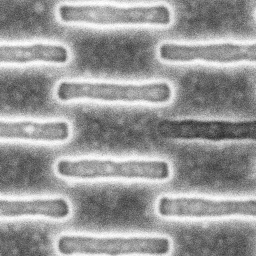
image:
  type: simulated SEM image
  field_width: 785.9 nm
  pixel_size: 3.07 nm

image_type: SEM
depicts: holes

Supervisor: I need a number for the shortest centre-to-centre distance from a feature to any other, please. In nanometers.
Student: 237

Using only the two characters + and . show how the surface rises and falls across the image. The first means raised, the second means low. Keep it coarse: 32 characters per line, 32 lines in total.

++++++++++++++++++++++++++++++++
+++++++..............+++++++++++
++++++++.............+++++++++++
++++++++++++++++++++++++++++++++
++++++++++++++++++++++++++++++++
+++....+++++++++++++..++........
........++++++++++++............
........++++++++++++............
++++++++++++++++++++++++++++++++
++++++++++++++++++++++++++++++++
+++++++.........++...+++++++++++
+++++++..............+++++++++++
++++++++.+++.........+++++++++++
++++++++++++++++++++++++++++++++
++++++++++++++++++++++++++++++++
........++++++++++++++.........+
.........++++++++++++++.........
+++.....++++++++++++++++++....++
++++++++++++++++++++++++++++++++
++++++++++++++++++++++++++++++++
+++++++..............+++++++++++
+++++++..............+++++++++++
+++++++++++++++++++.++++++++++++
++++++++++++++++++++++++++++++++
++++++++++++++++++++++++++++++++
.........+++++++++++............
.........+++++++++++............
++++++++++++++++++++++++++++++++
++++++++++++++++++++++++++++++++
++++++++...+++++++++++++++++++++
+++++++..............+++++++++++
+++++++..............+++++++++++